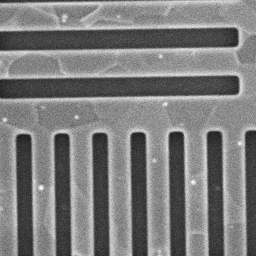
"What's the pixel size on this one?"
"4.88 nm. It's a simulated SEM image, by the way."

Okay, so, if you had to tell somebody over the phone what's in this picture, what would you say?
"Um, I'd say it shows groups of lines, slits or small figures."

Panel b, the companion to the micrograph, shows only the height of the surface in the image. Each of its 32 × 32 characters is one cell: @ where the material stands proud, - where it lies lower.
@@@@@@@@@@@@@@@@@@@@@@@@@@@@@@@@
@@@@@@@@@@@@@@@@@@@@@@@@@@@@@@@@
@@@@@@@@@@@@@@@@@@@@@@@@@@@@@@@@
@@@@@@@@@@@@@@@@@@@----------@@@
------------------------------@@
------------------------------@@
@@@@@@@@@@@@@@@@@@@@@@@@@@@@@@@@
@@@@@@@@@@@@@@@@@@@@@@@@@@@@@@@@
@@@@@@@@@@@@@@@@@@@@@@@@@@@@@@@@
@@@@@@@@@@@@@@@@@------------@@@
------------------------------@@
------------------------------@@
@@@@@@@@@@@@@@@@@@@@@@@@@@@@@@@@
@@@@@@@@@@@@@@@@@@@@@@@@@@@@@@@@
@@@@@@@@@@@@@@@@@@@@@@@@@@@@@@@@
@@@@@@@@@@@@@@@@@@@@@@@@@@@@@@@@
@@@@@@@@@@@@@@@@@@@@@@-@@@-@@@@-
@@--@@@--@@---@@--@@@--@@@--@@--
@@--@@@--@@---@@--@@@--@@@--@@@-
@@--@@@--@@@--@@--@@@--@@@--@@@-
@@--@@@--@@@--@@--@@@--@@@--@@@-
@@--@@@--@@@--@@--@@@--@@@--@@@-
@@--@@@--@@@--@@--@@@--@@@--@@@-
@@--@@@--@@@--@@--@@@--@@@--@@@-
@@--@@@--@@@--@@--@@@--@@@--@@@-
@@--@@@--@@@--@@--@@@--@@@--@@@-
@@--@@@--@@@--@@--@@@--@@@--@@@-
@@--@@@--@@@--@@--@@@--@@@--@@@-
@@--@@@--@@@--@@--@@@--@@@--@@@-
@@--@@@--@@@--@@--@@@--@@@--@@@-
@@--@@@--@@@--@@---@@--@@@--@@@-
@@--@@@--@@@--@@---@@--@@@--@@@-